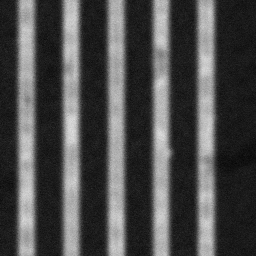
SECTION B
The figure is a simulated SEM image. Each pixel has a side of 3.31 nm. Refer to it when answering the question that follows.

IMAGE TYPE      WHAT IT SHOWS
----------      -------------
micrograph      parallel lines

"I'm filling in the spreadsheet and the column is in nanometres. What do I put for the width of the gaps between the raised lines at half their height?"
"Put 109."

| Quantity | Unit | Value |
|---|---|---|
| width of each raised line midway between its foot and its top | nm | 41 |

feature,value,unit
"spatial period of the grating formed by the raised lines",0.149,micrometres